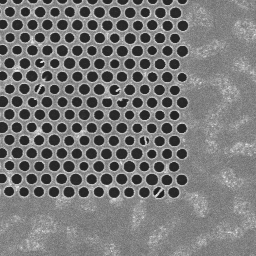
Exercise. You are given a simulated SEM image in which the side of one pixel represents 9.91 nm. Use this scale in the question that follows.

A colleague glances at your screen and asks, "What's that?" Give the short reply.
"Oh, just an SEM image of a regular array of holes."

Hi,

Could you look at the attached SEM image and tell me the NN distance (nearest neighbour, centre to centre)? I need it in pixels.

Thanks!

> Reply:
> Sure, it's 14.5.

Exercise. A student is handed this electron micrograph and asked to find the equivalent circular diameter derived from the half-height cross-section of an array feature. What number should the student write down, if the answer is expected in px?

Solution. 10.3